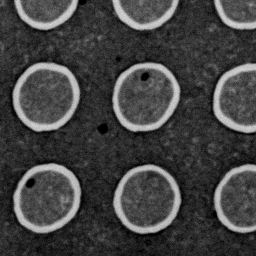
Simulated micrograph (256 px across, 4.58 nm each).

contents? raised bodies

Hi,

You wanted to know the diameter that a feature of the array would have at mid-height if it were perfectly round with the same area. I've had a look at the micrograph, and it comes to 0.289 µm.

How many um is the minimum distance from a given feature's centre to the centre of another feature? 0.458